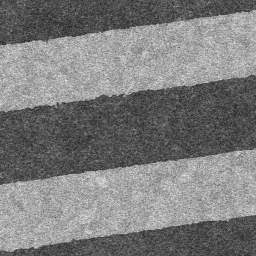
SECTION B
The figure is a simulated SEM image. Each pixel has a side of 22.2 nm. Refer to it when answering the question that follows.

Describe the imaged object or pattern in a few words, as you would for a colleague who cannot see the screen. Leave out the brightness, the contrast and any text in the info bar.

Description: one or a few lines or trenches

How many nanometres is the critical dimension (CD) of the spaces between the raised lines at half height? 1620